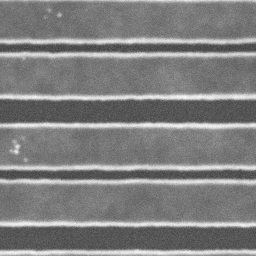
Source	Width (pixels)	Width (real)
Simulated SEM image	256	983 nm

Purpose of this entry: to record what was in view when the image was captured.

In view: lines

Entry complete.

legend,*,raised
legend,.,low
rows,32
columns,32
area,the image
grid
********************************
********************************
********************************
********************************
********************************
................................
................................
********************************
********************************
********************************
********************************
********************************
................................
................................
................................
................................
********************************
********************************
********************************
********************************
********************************
................................
................................
********************************
********************************
********************************
********************************
********************************
................................
................................
................................
..**.******.********.***.*******